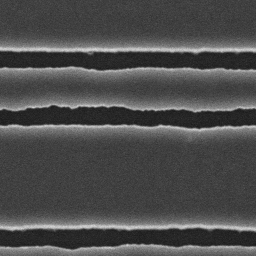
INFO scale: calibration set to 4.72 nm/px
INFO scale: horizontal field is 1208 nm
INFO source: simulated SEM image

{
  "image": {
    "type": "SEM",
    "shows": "lines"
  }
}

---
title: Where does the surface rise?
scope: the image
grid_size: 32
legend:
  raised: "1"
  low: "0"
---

11111111111111111111111111111111
11111111111111111111111111111111
11111111111111111111111111111111
11111111111111111111111111111111
11111111111111111111111111111111
11111111111111111111111111111111
00000000000000000000000000000000
00000000000000000000000000000000
10010111110000000111000100000000
11111111111111111111111111111111
11111111111111111111111111111111
11111111111111111111111111111111
11111111111111111111111111111111
11110000000000001111111111111111
00000000000000000000000000000000
00000000000000000000000000000000
11111111111111111111111111111111
11111111111111111111111111111111
11111111111111111111111111111111
11111111111111111111111111111111
11111111111111111111111111111111
11111111111111111111111111111111
11111111111111111111111111111111
11111111111111111111111111111111
11111111111111111111111111111111
11111111111111111111111111111111
11111111111111111111111111111111
11111111111111111111111111111111
11110001110000011111101000001111
00000000000000000000000000000000
00000000000000000000000000000000
11111111111111111111111111111111